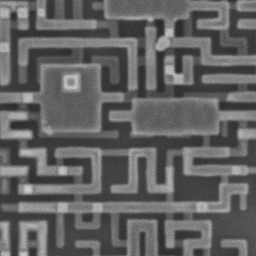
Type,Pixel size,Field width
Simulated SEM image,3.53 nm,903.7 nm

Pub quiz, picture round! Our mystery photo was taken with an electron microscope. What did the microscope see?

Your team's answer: wiring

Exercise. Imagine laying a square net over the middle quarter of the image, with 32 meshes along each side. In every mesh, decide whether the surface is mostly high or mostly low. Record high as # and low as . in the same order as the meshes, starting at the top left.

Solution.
#########.......##...##..##...##
#########.......##...##..##...##
#########.......##...##..###.###
#########.......##...##..#######
#########.......##...##..#######
#########.......##...##.........
#########.......................
###############.................
###############..............###
##########.......###############
#########........###############
#########........###############
#########..#####################
#########..#####################
#########........###############
#########........###############
#########........###############
....................##########..
................................
................................
................................
#########.......#######.......##
#########.......#######.......##
.......##.......##...##.......##
.......##.......##...##.......##
.......##.......##...##.......##
#####..##.......##...##...#...##
####...##.......##...##...#...##
.......##.......##...##...#.....
.......##.......##...##...#.....
#########...######...######.....
#########...######...######.....